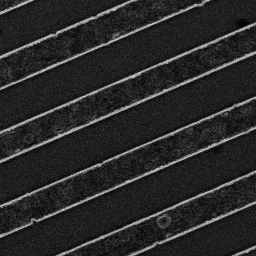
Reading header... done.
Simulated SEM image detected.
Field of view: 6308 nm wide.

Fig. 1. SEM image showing one or a few lines or trenches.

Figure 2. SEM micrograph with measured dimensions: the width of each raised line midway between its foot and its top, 700 nm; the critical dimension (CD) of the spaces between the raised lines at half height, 40 pixels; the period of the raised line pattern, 1690 nanometres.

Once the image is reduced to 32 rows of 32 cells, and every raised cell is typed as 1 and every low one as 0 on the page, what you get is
11100000000000011111111110000000
10000000000001111111111000000000
00000000000111111111000000000000
00000000111111111100000000000001
00000011111111110000000000001111
00001111111111000000000000111111
01111111111000000000000111111111
11111111100000000000011111111100
11111100000000000001111111110000
11110000000000001111111110000000
11000000000000111111111000000000
00000000000011111111100000000000
00000000011111111100000000000001
00000001111111110000000000000111
00000111111111000000000000011111
00111111111000000000000011111111
11111111100000000000001111111110
11111100000000000000111111111000
11110000000000000111111111000000
11000000000000011111111100000000
00000000000001111111100000000000
00000000001111111110000000000000
00000000111111111000000000000111
00000111111111100000000000011111
00011111111100000000000001111111
01111111110000000000001111111111
11111110000000000000111111111000
11111000000000000011111111100000
11100000000000011111111110000000
00000000000001111111110000000000
00000000000111111111000000000000
00000000111111111100000000000011